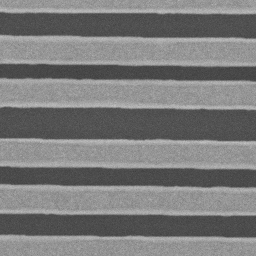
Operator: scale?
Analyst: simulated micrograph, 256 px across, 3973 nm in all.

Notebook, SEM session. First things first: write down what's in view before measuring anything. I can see lines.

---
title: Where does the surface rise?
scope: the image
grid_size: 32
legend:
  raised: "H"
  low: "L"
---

HHHHHHHHHHHHHHHHHHHHHHHHHHHHHHHH
LLLLLLLLLLLLLLHHHHHHHHHHHHHHHHHH
LLLLLLLLLLLLLLLLLLLLLLLLLLLLLLLL
LLLLLLLLLLLLLLLLLLLLLLLLLLLLLLLL
LLLLLLLLLLLLLLLLLLLLLLLLLLLLLLLL
HHHHHHHHHHHHHHHHHHHHHHHHHHHHHHHH
HHHHHHHHHHHHHHHHHHHHHHHHHHHHHHHH
HHHHHHHHHHHHHHHHHHHHHHHHHHHHHHHH
LLLLLLLLLLLLLLLLLLLLLLLLLLLLLLLL
LLLLLLLLLLLLLLLLLLLLLLLLLLLLLLLL
HHHHHHHHHHHHHHHHHHHHHHHHHHHHHHHH
HHHHHHHHHHHHHHHHHHHHHHHHHHHHHHHH
HHHHHHHHHHHHHHHHHHHHHHHHHHHHHHHH
LLLLLLLLLLLLLLLLLLLLLLLLLLLLLHHH
LLLLLLLLLLLLLLLLLLLLLLLLLLLLLLLL
LLLLLLLLLLLLLLLLLLLLLLLLLLLLLLLL
LLLLLLLLLLLLLLLLLLLLLLLLLLLLLLLL
HHHLLLLLLLLLLLLLLLLLLLLLLLLLLLLL
HHHHHHHHHHHHHHHHHHHHHHHHHHHHHHHH
HHHHHHHHHHHHHHHHHHHHHHHHHHHHHHHH
HHHHHHHHHHHHHHHHHHHHHHHHHHHHHHHH
LLLLLLLLLLLLLLLLLLLLLLLLLLLLLLLL
LLLLLLLLLLLLLLLLLLLLLLLLLLLLLLLL
HHHHHHHHHHHHHHHHHHHHHHHLLLLLLLLL
HHHHHHHHHHHHHHHHHHHHHHHHHHHHHHHH
HHHHHHHHHHHHHHHHHHHHHHHHHHHHHHHH
HHHHHHHHHHHHHHHHHHHHHHHHHHHHHHHH
LLLLLLLLLLLLLLLLLLLLLLLLLLLLLLLL
LLLLLLLLLLLLLLLLLLLLLLLLLLLLLLLL
LLLLLLLLLLLLLLLLLLLLLLLLLLLLLLLL
HHHHHHHHHHHHHHHHHHHHHHHHHHHHHHHH
HHHHHHHHHHHHHHHHHHHHHHHHHHHHHHHH